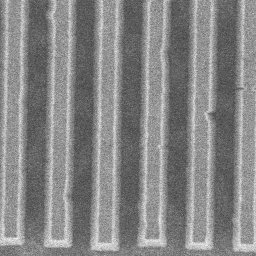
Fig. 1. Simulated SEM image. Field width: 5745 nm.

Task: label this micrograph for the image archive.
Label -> parallel lines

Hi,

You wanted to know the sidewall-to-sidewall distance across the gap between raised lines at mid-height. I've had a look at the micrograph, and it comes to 583 nm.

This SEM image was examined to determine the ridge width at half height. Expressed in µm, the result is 0.485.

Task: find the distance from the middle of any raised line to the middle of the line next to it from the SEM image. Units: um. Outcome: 1.06